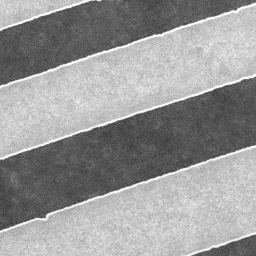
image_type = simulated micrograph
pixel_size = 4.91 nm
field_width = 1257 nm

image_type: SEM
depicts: one or a few lines or trenches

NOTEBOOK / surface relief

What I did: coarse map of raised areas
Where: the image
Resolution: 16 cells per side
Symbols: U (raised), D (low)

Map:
UUUUDDDDDDDDDDDU
UDDDDDDDDDDDUUUU
DDDDDDDDDUUUUUUU
DDDDDDUUUUUUUUUU
DDDUUUUUUUUUUUUU
UUUUUUUUUUUUUDDD
UUUUUUUUUUDDDDDD
UUUUUUUDDDDDDDDD
UUUUDDDDDDDDDDDD
UDDDDDDDDDDDDDDU
DDDDDDDDDDDDUUUU
DDDDDDDDDUUUUUUU
DDDDDDUUUUUUUUUU
DDDUUUUUUUUUUUUU
UUUUUUUUUUUUUUUU
UUUUUUUUUUUUUDDD